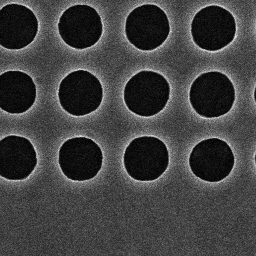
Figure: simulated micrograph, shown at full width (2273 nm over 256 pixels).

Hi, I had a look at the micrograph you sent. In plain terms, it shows a regular array of holes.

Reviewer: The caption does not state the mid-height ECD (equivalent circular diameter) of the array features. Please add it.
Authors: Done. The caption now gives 399 nm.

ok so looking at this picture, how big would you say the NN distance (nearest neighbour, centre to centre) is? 582 nanometers